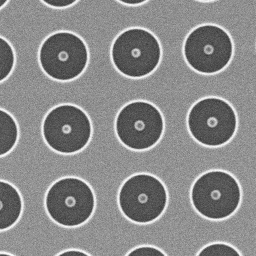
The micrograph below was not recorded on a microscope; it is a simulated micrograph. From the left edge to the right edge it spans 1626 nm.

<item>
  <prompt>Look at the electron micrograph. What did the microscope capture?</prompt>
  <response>an array of small figures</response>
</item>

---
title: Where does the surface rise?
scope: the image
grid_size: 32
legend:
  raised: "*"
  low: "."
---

.*****...*******.***************
********************************
********************************
*************************...****
******....*****....****......***
.****.....****......***......***
..***......***......***......***
..***......***......***......***
.****......****....*****....****
.*****....******..**************
********************************
********************************
*************************...****
*******...*****....*****.....***
.*****.....****.....****.....***
..***......***...*..****..*...**
..***......****.....****.....***
..****.....****.....*****....***
.******...******..**************
********************************
********************************
**************************..****
*******...******....*****....***
..****.....****......***......**
..****......***......***......**
...***..*...***......***......**
...***......***.....*****....***
..*****....*****...*************
.*******************************
********************************
***************************.****
********..******....*****.....**